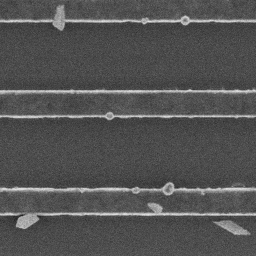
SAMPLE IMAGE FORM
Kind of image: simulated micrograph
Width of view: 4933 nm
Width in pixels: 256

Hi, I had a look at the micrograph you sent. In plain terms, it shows lines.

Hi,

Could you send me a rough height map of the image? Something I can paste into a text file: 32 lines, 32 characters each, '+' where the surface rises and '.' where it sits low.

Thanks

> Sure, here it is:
++++++++++++++++++++++++++++++++
++++++++++++++++++++++++++++++++
++++++++++++++++++++++++++++++++
.......+........................
................................
................................
................................
................................
................................
................................
................................
++++++++++++++++++++++++++++++++
++++++++++++++++++++++++++++++++
++++++++++++++++++++++++++++++++
++++++++++++++++++++++++++++++++
................................
................................
................................
................................
................................
................................
................................
................................
....................++..........
++++++++++++++++++++++++++++++++
++++++++++++++++++++++++++++++++
++++++++++++++++++++++++++++++++
..+++...........................
................................
................................
................................
................................